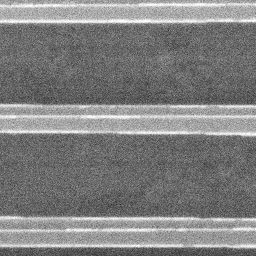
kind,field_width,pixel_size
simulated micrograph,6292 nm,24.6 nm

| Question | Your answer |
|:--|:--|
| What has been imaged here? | lines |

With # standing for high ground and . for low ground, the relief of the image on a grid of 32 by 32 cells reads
################################
################################
################################
................................
................................
................................
................................
................................
................................
................................
................................
................................
................................
################################
################################
################################
.....###########################
................................
................................
................................
................................
................................
................................
................................
................................
................................
................................
################################
################################
################################
################################
................................